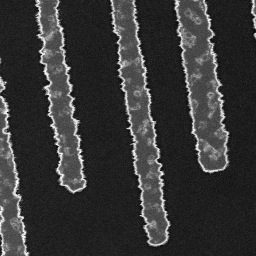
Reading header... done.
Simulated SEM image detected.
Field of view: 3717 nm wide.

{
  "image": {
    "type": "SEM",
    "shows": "one or a few lines or trenches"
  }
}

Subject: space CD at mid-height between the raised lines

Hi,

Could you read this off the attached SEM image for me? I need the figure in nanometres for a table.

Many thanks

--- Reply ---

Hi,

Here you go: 675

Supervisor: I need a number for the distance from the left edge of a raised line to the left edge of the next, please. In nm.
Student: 1030